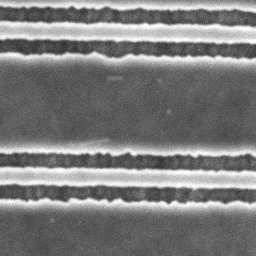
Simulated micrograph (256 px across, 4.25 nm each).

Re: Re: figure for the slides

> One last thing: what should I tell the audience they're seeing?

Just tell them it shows lines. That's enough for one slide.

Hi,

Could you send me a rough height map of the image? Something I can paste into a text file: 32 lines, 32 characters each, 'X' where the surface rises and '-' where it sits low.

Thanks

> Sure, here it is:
XXXXXXXXXXXXXXXXXXXXXXXXXXXXXXXX
--------------------------------
--------------------------------
XXXXXXXXXXXXXXXXXXXXXXXXXXXXXXXX
XXXXXXXXXXXXXXXXXXXXXXXXXXXXXXXX
--------------------------------
--------------------------------
XXXXXXXXXXXXXXXXXXXXXXXXXXXXXXXX
XXXXXXXXXXXXXXXXXXXXXXXXXXXXXXXX
XXXXXXXXXXXXXXXXXXXXXXXXXXXXXXXX
XXXXXXXXXXXXXXXXXXXXXXXXXXXXXXXX
XXXXXXXXXXXXXXXXXXXXXXXXXXXXXXXX
XXXXXXXXXXXXXXXXXXXXXXXXXXXXXXXX
XXXXXXXXXXXXXXXXXXXXXXXXXXXXXXXX
XXXXXXXXXXXXXXXXXXXXXXXXXXXXXXXX
XXXXXXXXXXXXXXXXXXXXXXXXXXXXXXXX
XXXXXXXXXXXXXXXXXXXXXXXXXXXXXXXX
XXXXXXXXXXXXXXXXXXXXXXXXXXXXXXXX
XXXXXXXXXXXXXXXXXXXXXXXXXXXXXXXX
--------------------------------
--------------------------------
XXXXXXXXXXXXXXXXXXXXXXXXXXXXXXXX
XXXXXXXXXXXXXXXXXXXXXXXXXXXXXXXX
--------------------------X---XX
--------------------------------
XXXXXXXXXXXXXXXXXXXXXXXXXXXX-XX-
XXXXXXXXXXXXXXXXXXXXXXXXXXXXXXXX
XXXXXXXXXXXXXXXXXXXXXXXXXXXXXXXX
XXXXXXXXXXXXXXXXXXXXXXXXXXXXXXXX
XXXXXXXXXXXXXXXXXXXXXXXXXXXXXXXX
XXXXXXXXXXXXXXXXXXXXXXXXXXXXXXXX
XXXXXXXXXXXXXXXXXXXXXXXXXXXXXXXX